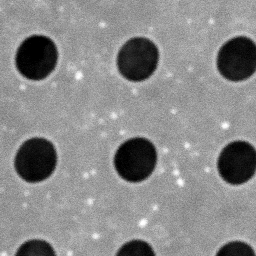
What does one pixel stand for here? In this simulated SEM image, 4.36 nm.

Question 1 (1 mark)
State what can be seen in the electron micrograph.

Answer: holes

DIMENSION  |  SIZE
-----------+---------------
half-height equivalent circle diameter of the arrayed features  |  198 nm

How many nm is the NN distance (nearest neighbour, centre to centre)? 436